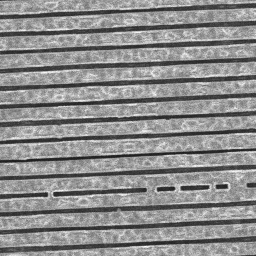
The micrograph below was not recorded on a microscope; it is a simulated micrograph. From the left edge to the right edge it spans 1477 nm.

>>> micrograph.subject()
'parallel lines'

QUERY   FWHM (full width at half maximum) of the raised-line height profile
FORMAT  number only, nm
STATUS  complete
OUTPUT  76.4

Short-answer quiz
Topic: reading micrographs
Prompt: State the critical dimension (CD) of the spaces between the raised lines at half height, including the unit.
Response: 4.49 px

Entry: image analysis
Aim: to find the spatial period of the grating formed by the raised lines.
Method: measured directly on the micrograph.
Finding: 17.9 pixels